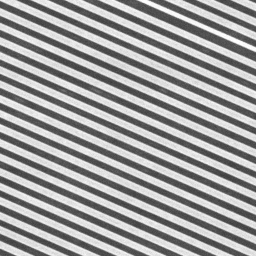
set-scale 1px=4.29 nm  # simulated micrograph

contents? parallel lines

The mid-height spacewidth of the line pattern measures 29.5 nm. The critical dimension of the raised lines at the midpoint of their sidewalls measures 29.5 nm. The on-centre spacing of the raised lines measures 57.3 nm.